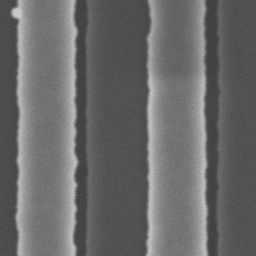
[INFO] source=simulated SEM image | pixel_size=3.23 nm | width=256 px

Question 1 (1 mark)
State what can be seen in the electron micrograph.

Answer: lines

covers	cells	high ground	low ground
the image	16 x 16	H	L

LHHHHLLLLHHHHLLL
LHHHHLLLLHHHHLLL
LHHHHLLLLHHHHLLL
LHHHHLLLLHHHHLLL
LHHHHLLLLHHHHLLL
LHHHHLLLLHHHHLLL
LHHHHLLLLHHHHLLL
LHHHHLLLLHHHHLLL
LHHHHLLLLHHHHLLL
LHHHHLLLLHHHHLLL
LHHHHLLLLHHHHLLL
LHHHHLLLLHHHHLLL
LHHHHLLLLHHHHLLL
LHHHHLLLLHHHHLLL
LHHHHLLLLHHHHLLL
LHHHHLLLLHHHHLLL